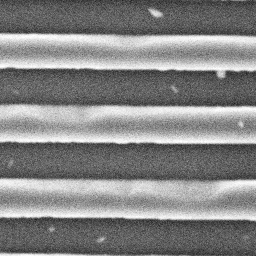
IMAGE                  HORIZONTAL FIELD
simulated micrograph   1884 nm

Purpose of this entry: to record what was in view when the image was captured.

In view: lines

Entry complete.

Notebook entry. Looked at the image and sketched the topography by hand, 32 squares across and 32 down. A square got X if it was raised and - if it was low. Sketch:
--------------------------------
--------------------------------
--------------------------------
--------------------------------
XXXXXXX-------------------------
XXXXXXXXXXXXXXXXXXXXXXXXXXXXXXXX
XXXXXXXXXXXXXXXXXXXXXXXXXXXXXXXX
XXXXXXXXXXXXXXXXXXXXXXXXXXXXXXXX
------------XXXXXXXXXXXXXXXXXXXX
--------------------------------
--------------------------------
--------------------------------
--------------------------------
--------------------------------
XXXXXXXXXXXXXXXXXXXXXXXXXXXXXXXX
XXXXXXXXXXXXXXXXXXXXXXXXXXXXXXXX
XXXXXXXXXXXXXXXXXXXXXXXXXXXXXXXX
XXXXXXXXXXXXXXXXXXXXXXXXXXXXXXXX
--------------------------------
--------------------------------
--------------------------------
--------------------------------
--------------------------------
XXXXXXXXXXXXXXXXXXXXXXX-XXXXXXXX
XXXXXXXXXXXXXXXXXXXXXXXXXXXXXXXX
XXXXXXXXXXXXXXXXXXXXXXXXXXXXXXXX
XXXXXXXXXXXXXXXXXXXXXXXXXXXXXXXX
--------------------------------
--------------------------------
--------------------------------
--------------------------------
--------------------------------